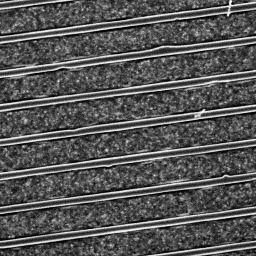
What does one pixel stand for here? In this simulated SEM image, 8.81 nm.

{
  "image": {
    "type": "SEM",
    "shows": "parallel lines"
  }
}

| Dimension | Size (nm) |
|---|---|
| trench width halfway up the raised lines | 237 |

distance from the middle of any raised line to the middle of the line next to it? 33.8 px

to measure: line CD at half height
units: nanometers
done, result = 57.9